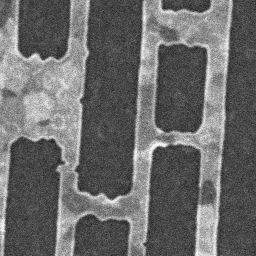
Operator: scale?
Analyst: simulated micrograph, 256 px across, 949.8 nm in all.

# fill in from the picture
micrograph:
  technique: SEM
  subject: one or a few lines or trenches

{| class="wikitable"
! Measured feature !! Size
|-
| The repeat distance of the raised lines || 0.258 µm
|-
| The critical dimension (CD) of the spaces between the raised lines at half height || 201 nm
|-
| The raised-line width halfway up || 63.4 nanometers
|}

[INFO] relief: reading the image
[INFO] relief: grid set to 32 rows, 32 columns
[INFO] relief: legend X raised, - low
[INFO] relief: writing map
XX-------XX-------XX------XXX---
XX-------XX-------XXX-XX--XXX---
XX-------XX-------XXXXXXXXXXX---
XX-------XX-------XXXXXXXXXXX---
XX-------XX-------XXXXXXXXXXX---
XX-------XX-------XX---XXXXX----
XX-------XX-------XX------XX----
XXXXX-X-XXX-------XX------XX----
XXXXXXXXXXX-------XX------XX----
XXXXXXXXXXX------XXX------XX----
XXXXXXXXXX-------XX-------XX----
XXXXXXXXXX-------XX-------XX----
XXXXXXXXXX-------XX-------XX----
XXXXXXXXXX-------XX-------XX----
XXXXXXXXXX-------XX-------XX----
XXXXXXXXXX-------XX------XXX----
XXXXXXXXXX-------XXX-----XXX----
XX-----XXX-------XXXXXXXXXXX----
X-------XX-------XX------XXX----
X-------XX-------XX------XXX----
X-------XX-------XX------XXX----
X------XX--------XX------XX-----
X-------XX-------XX------XX-----
X-------XX-------XX------XX-----
X------XXXX-X---XX-------XX-----
X------XXXXXXXXXXX-------XX-----
X------XXXXXXXXXXX-------XX-----
-------XXX------XX-------XX-----
-------XX-------XX-------XX-----
-------XX-------XX-------XX-----
-------XX-------XX-------XX-----
-------XX-------XX-------XX-----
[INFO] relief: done